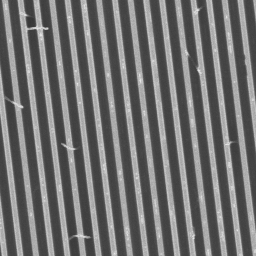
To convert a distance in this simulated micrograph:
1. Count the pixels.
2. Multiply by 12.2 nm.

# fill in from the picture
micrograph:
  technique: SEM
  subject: parallel lines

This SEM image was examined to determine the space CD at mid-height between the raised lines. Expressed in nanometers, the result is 104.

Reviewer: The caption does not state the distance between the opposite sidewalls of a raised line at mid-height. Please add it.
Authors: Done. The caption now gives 0.0816 micrometres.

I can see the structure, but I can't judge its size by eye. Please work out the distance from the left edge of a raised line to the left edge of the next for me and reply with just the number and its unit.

190 nanometres